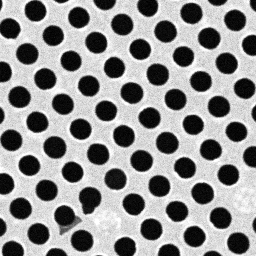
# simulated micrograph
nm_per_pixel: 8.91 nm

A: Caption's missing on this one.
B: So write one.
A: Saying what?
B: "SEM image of a regular array of holes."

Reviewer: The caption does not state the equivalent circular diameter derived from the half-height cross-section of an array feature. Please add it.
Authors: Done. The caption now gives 200 nanometres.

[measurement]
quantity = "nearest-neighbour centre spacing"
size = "0.273 um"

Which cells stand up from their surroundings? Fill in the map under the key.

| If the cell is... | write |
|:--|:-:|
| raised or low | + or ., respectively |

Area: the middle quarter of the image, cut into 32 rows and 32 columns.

....++++++.....++++++....++++..+
...+++++++.....++++++.....++++++
++++++++++.....+++++......++++++
++++....+++...+++++++.....+++++.
+++......+++++++..+++.....+++++.
+++......++++++....++++.++++++++
++++.....+++++......++++++...+++
.+++....++++++......+++++.....++
..++++++++++++......+++++......+
..+++++++...+++....++++++......+
...+++++.....+++++++++++++....++
..++++++.....++++++....++++..+++
.+++++++.....++++++.....++++++++
++++++++.....+++++......++++++..
++....+++++++++++++.....++++++..
+......+++++++..++++...+++++++..
+......++++++....+++++++++++++..
++.....+++++......++++++...++++.
++....++++++......+++++.....++++
+++++++++++++.....+++++......+++
.+++++....++++...++++++......+++
.+++++.....+++++++..++++....++++
++++++......+++++.....+++..+++++
++++++.....+++++......+++++++..+
+..+++.....+++++......++++++....
....+++++++++++++.....+++++.....
.....++++++...++++...++++++.....
.....+++++.....+++++++++++++....
.....+++++......++++++....+++...
+...++++++......+++++.....++++++
+++++++++++....++++++......+++++
++++.....+++..+++++++......+++++